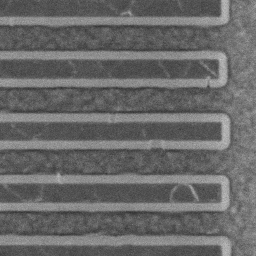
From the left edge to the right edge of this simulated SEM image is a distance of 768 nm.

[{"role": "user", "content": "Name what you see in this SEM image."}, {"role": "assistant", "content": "one or a few lines or trenches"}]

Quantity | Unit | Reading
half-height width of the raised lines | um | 0.0811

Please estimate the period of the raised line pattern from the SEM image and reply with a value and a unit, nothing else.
186 nm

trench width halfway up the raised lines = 0.105 µm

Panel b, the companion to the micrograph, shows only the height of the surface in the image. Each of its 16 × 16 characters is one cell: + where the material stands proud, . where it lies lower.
++++++++++++++..
................
................
+++++++++++.....
++++++++++++++..
................
................
++++++++++++++..
++++++++++++++..
................
................
++++++++++++++..
++++++++++++++..
................
................
++++++++++++++..